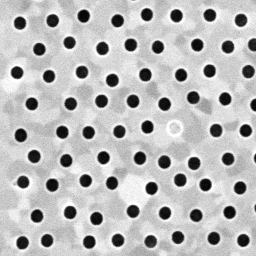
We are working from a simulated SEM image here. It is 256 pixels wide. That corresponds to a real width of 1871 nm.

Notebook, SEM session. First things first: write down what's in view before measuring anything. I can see a regular array of holes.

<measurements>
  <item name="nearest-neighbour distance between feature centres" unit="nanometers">201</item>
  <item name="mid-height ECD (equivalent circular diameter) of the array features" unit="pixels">13.6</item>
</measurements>